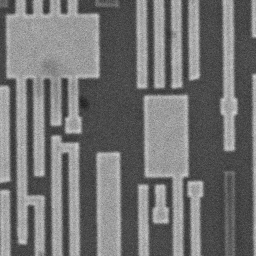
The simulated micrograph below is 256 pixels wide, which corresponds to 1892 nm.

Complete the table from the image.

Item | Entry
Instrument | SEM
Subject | wiring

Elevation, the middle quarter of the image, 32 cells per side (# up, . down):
#########.........###..##..##...
#########.........###..##..##...
#########.........###..##..##...
.###..............###..##..##...
.##...............###..##..##...
.##...............###..##..##...
.##.............................
.##.............................
.##.................###########.
.##.................###########.
.##.................###########.
.##.................###########.
.##.................###########.
.###................###########.
.###................###########.
.###................###########.
.###................###########.
....................###########.
....................###########.
....................###########.
###.................###########.
###.................###########.
.##........###......###########.
.##.....######......###########.
.##.....######......###########.
.##.....######......###########.
.##.....######......###########.
.##.....######......###########.
.##.....######.............###..
.##.....######.............##...
..#.....######.....##..##..##..#
..#.....######.....##..##..##..#